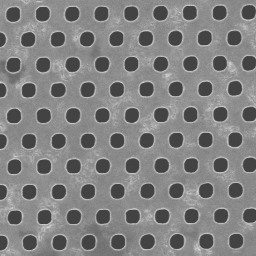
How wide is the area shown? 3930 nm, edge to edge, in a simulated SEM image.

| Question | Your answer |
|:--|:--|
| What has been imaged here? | a regular array of holes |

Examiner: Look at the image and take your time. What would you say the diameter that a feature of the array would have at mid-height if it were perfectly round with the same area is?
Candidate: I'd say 227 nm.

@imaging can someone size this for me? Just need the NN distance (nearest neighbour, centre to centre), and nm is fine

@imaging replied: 445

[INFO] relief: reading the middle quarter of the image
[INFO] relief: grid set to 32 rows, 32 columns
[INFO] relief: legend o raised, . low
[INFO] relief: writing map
....oooo...oooo....ooo....oooo..
o..ooooo...ooooo..ooooo..oooooo.
oooooooooooooooooooooooooooooooo
oooooooooooooooooooooooooooooooo
ooooooooooooooooooooooooooo..ooo
oooo....oooo...oooo...oooo....oo
oooo....ooo....oooo....ooo....oo
oooo...ooooo...oooo...ooooo..ooo
oooooooooooooooooooooooooooooooo
oooooooooooooooooooooooooooooooo
oooooooooooooooooooooooooooooooo
o..ooooo...ooooo...oooo...oooo..
o...oooo...oooo....oooo...oooo..
o...oooo...oooo....oooo...oooo..
o..ooooo...ooooo..oooooo.oooooo.
oooooooooooooooooooooooooooooooo
oooooooooooooooooooooooooooooooo
oooooooooooo..oooooo..ooooo..ooo
oooo....oooo...oooo...oooo....oo
.ooo....ooo....oooo...oooo....oo
ooooo..ooooo..ooooo...ooooo..ooo
oooooooooooooooooooooooooooooooo
oooooooooooooooooooooooooooooooo
oooooooooooooooooooooooooooooooo
o...oooo...oooo....oooo...oooo..
o...oooo....ooo....oooo...oooo..
o...oooo...ooooo...oooo...oooo..
oooooooooooooooooooooooooooooooo
oooooooooooooooooooooooooooooooo
oooooooooooooooooooooooooooooooo
ooooo..ooooo...ooooo..ooooo...oo
oooo....oooo...oooo....ooo....oo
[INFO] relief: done